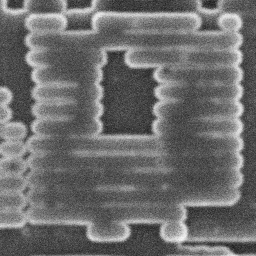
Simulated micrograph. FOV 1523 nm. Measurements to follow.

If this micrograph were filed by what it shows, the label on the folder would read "wiring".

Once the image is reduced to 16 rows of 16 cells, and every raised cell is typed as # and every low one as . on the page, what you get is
................
..##..######..#.
..#############.
..#####.#######.
..####....#####.
..####....#####.
#.####....#####.
#.####....#####.
#######..######.
###############.
###############.
###############.
###############.
############....
......##..##....
................